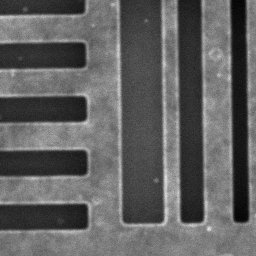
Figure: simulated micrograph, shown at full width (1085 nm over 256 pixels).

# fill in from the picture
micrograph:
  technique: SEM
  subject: groups of lines, slits or small figures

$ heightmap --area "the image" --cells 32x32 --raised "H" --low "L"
LLLLLLLLLLLHHHHLLLLLHHLLLHHHHLLH
LLLLLLLLLLLHHHHLLLLLHHLLLHHHHLLH
HHHHHHHHHHHHHHHLLLLLHHLLLHHHHLLH
HHHHHHHHHHHHHHHLLLLLHHLLLHHHHLLH
HHHHHHHHHHHHHHHLLLLLHHLLLHHHHLLH
LLLLLLLLLLLHHHHLLLLLHHLLLHHHHLLH
LLLLLLLLLLLHHHHLLLLLHHLLLHHHHLLH
LLLLLLLLLLLHHHHLLLLLHHLLLHHHHLLH
LLLLLLLLLLHHHHHLLLLLHHLLLHHHHLLH
HHHHHHHHHHHHHHHLLLLLHHLLLHHHHLLH
HHHHHHHHHHHHHHHLLLLLHHLLLHHHHLLH
HHHHHHHHHHHHHHHLLLLLHHLLLHHHHLLH
LLLLLLLLLLLHHHHLLLLLHHLLLHHHHLLH
LLLLLLLLLLLHHHHLLLLLHHLLLHHHHLLH
LLLLLLLLLLLHHHHLLLLLLHLLLHHHHLLH
HHHHHHHHHHHHHHHLLLLLLHLLLHHHHLLH
HHHHHHHHHHHHHHHLLLLLLHLLLHHHHLLH
HHHHHHHHHHHHHHHLLLLLLHLLLHHHHLLH
HHHHHHHHHHHHHHHLLLLLLHLLLLHHHLLH
LLLLLLLLLLLHHHHLLLLLLHLLLLHHHLLH
LLLLLLLLLLLHHHHLLLLLLHLLLLHHHLLH
LLLLLLLLLLLHHHHLLLLLLHLLLLHHHLLH
HHHHHHHHHHHHHHHLLLLLLHLLLLHHHLLH
HHHHHHHHHHHHHHHLLLLLLHLLLLHHHLLH
HHHHHHHHHHHHHHHLLLLLLHLLLLHHHLLH
LLLLLLLLLLLHHHHLLLLLLHLLLLHHHLLH
LLLLLLLLLLLHHHHLLLLLLHLLLLHHHLLH
LLLLLLLLLLLHHHHLLLLLLHHLLHHHHLLH
LLLLLLLLLLLHHHHHHHHHHHHHHHHHHHHH
HHHHHHHHHHHHHHHHHHHHHHHHHHHHHHHH
HHHHHHHHHHHHHHHHHHHHHHHHHHHHHHHH
HHHHHHHHHHHHHHHHHHHHHHHHHHHHHHHH